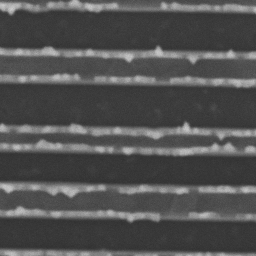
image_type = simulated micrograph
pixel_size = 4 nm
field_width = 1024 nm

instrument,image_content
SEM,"one or a few lines or trenches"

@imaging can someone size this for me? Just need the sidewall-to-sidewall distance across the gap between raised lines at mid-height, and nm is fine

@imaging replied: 138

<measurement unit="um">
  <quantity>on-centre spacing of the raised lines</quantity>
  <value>0.269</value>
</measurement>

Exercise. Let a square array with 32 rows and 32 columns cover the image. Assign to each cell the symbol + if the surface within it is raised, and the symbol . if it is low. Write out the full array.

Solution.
++++++++++++++++++++++++++++++++
.+..............................
................................
................................
................................
................................
++++++++++++++++..+++.......+...
++++++++++++++++++++++++++++++++
++++++++++++++++++++++++++++++++
++++++++++++++++++++++++++++++++
.......................+++++++++
................................
................................
................................
................................
.........+......................
++++++++++++++++++++++++++++++++
++++++++++++++++++++++++++++++++
++++++++++++++++++++++++++++++++
................................
................................
................................
................................
++++++++++++++++++++++++++++++++
++++++++++++++++++++++++++++++++
++++++++++++++++++++++++++++++++
++++++++++++++++++++++++++++++++
................+..+............
................................
................................
................................
++++++++++++++..................